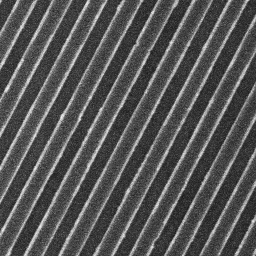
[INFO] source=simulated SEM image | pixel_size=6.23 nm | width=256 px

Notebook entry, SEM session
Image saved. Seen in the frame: parallel lines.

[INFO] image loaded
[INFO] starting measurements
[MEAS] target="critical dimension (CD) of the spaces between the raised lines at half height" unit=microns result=0.0883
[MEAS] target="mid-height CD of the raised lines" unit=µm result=0.11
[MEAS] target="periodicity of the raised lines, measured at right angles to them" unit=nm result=194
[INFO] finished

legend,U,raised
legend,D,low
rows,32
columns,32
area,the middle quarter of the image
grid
UUDDDDUUUUUDDDDUUUUUDDDUUUUUUDDD
UUDDDDUUUUDDDDUUUUUDDDDUUUUUDDDD
UDDDDUUUUUDDDDUUUUUDDDUUUUUUDDDD
UDDDDUUUUDDDDUUUUUDDDDUUUUUDDDDU
DDDDUUUUUDDDDUUUUUDDDUUUUUDDDDDU
DDDDUUUUDDDDUUUUUDDDDUUUUUDDDDUU
DDDUUUUUDDDDUUUUUDDDDUUUUDDDDUUU
DDDUUUUDDDDUUUUUDDDDUUUUUDDDDUUU
DDUUUUUDDDDUUUUUDDDDUUUUDDDDUUUU
DUUUUUDDDDUUUUUDDDDUUUUUDDDDUUUU
DUUUUUDDDDUUUUUDDDUUUUUDDDDUUUUU
UUUUUDDDDUUUUUDDDDUUUUUDDDDUUUUD
UUUUUDDDUUUUUDDDDUUUUUDDDDUUUUUD
UUUUDDDDUUUUUDDDDUUUUUDDDDUUUUDD
UUUUDDDUUUUUDDDDUUUUUDDDDUUUUUDD
UUUDDDDUUUUUDDDDUUUUUDDDDUUUUDDD
UUUDDDUUUUUDDDDUUUUUDDDDUUUUUDDD
UUDDDDUUUUUDDDDUUUUUDDDDUUUUDDDD
UDDDDUUUUUDDDDUUUUUDDDDUUUUUDDDD
UDDDDUUUUUDDDDUUUUUDDDUUUUUDDDDU
DDDDUUUUUDDDDUUUUUDDDDUUUUUDDDDU
DDDDUUUUUDDDDUUUUUDDDUUUUUDDDDUU
DDDUUUUUDDDDUUUUUDDDDUUUUUDDDDUU
DDDUUUUUDDDDUUUUDDDDUUUUUDDDDUUU
DDUUUUUDDDDUUUUUDDDDUUUUUDDDDUUU
DDUUUUUDDDDUUUUDDDDUUUUUDDDDUUUU
DUUUUUDDDDUUUUUDDDDUUUUUDDDDUUUU
DUUUUUDDDUUUUUDDDDUUUUUDDDDUUUUU
UUUUUDDDDUUUUUDDDUUUUUDDDDDUUUUD
UUUUDDDDUUUUUDDDDUUUUUDDDDUUUUUD
UUUUDDDDUUUUUDDDUUUUUDDDDUUUUUDD
UUUUDDDUUUUUDDDDUUUUUDDDDUUUUUDD